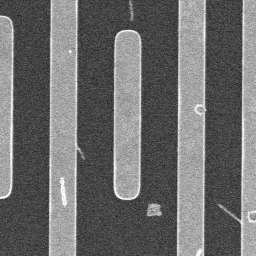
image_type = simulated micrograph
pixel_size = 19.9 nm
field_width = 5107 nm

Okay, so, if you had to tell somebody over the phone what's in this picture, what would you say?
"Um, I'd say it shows groups of lines, slits or small figures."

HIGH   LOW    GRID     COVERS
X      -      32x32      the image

------XXXX------------XXXX----XX
------XXXX------------XXXX----XX
X-----XXXX------------XXXX----XX
XX----XXXX------------XXXX----XX
XX----XXXX-----XX-----XXXX----XX
XX----XXXX----XXXX----XXXX----XX
XX----XXXX----XXXX----XXXX----XX
XX----XXXX----XXXX----XXXX----XX
XX----XXXX----XXXX----XXXX----XX
XX----XXXX----XXXX----XXXX----XX
X-----XXXX----XXXX----XXX-----XX
X-----XXXX----XXXX----XXX-----XX
X-----XXXX----XXXX----XXX-----XX
X-----XXXX----XXXX----XXXX----XX
X-----XXXX----XXXX----XXX-----XX
X-----XXXX----XXXX----XXX-----XX
X-----XXXX----XXXX----XXX-----XX
X-----XXX-----XXXX----XXX-----XX
X-----XXXX----XXXX----XXX-----XX
X-----XXX-----XXXX----XXX-----XX
X-----XXX-----XXXX----XXX-----XX
X-----XXX-----XXX-----XXX-----XX
X-----XXX-----XXX-----XXX-----XX
X-----XXX-----XXX-----XXX-----XX
X-----XXX------XX-----XXX-----XX
------XXX-------------XXX-----XX
------XXX-------------XXX-----XX
------XXX-------------XXX-----XX
------XXX-------------XXX-----XX
------XXX-------------XXX-----XX
------XXX-------------XXX-----XX
------XXX-------------XXX-----XX